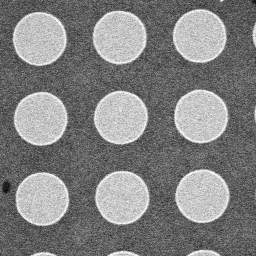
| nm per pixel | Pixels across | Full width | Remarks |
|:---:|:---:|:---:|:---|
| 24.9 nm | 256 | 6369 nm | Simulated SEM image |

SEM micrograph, an array of small figures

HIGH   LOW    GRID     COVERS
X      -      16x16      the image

----------------
-XXX--XXX--XXX--
-XXX--XXX--XXX--
-XXX--XXX--XX---
----------------
----------------
-XXX--XXX--XXX--
-XXX--XXX--XXX--
-XXX--XXX---XX--
----------------
----------------
-XXX--XXX--XXX--
-XXX--XXX--XXX--
-XXX---XX---XX--
----------------
----------------